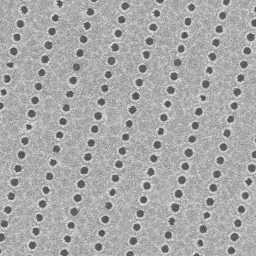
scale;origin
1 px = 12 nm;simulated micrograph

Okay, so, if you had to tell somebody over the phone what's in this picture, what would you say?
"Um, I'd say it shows a regular array of holes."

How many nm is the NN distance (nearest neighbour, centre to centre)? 168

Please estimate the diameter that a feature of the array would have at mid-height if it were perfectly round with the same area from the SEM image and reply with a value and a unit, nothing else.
0.0937 microns